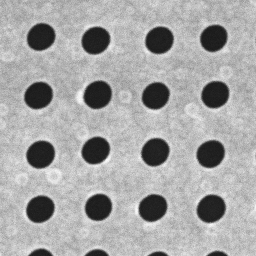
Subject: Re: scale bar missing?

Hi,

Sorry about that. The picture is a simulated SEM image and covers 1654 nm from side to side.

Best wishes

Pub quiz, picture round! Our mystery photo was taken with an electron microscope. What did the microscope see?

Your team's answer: a regular array of holes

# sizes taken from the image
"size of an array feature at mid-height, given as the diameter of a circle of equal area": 28.2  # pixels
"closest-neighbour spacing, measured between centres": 353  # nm